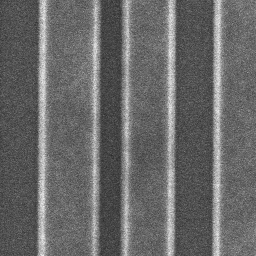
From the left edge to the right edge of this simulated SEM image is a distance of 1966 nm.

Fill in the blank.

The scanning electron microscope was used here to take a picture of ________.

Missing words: one or a few lines or trenches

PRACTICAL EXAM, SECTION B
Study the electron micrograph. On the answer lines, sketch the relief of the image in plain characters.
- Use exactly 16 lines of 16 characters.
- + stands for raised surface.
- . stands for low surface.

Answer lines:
...+++..+++...++
...+++..+++...++
...+++..+++...++
...+++..+++...++
...+++..+++...++
...+++..+++...++
...+++..+++...++
...+++..+++...++
...+++..+++...++
...+++..+++...++
...+++..+++...++
...+++..+++...++
...+++..+++...++
...+++..+++...++
...+++..+++...++
...+++..+++..+++